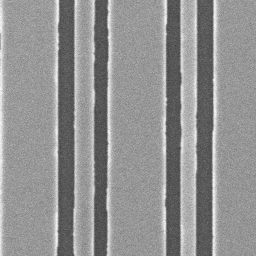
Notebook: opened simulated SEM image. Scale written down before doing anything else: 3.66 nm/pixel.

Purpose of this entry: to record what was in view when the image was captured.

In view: lines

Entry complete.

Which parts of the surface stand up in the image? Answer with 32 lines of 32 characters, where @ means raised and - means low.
@@@@@@@--@@@--@@@@@@@--@@--@@@@@
@@@@@@@--@@@--@@@@@@@--@@--@@@@@
@@@@@@@--@@@--@@@@@@@--@@--@@@@@
@@@@@@@--@@@--@@@@@@@--@@--@@@@@
@@@@@@@--@@@--@@@@@@@--@@--@@@@@
@@@@@@@--@@@--@@@@@@@--@@--@@@@@
@@@@@@@--@@@--@@@@@@@--@@--@@@@@
@@@@@@@--@@@--@@@@@@@--@@--@@@@@
@@@@@@@--@@@--@@@@@@@--@@--@@@@@
@@@@@@@--@@@--@@@@@@@--@@--@@@@@
@@@@@@@--@@@--@@@@@@@--@@--@@@@@
@@@@@@@--@@@--@@@@@@@--@@--@@@@@
@@@@@@@--@@@--@@@@@@@--@@--@@@@@
@@@@@@@--@@@--@@@@@@@--@@--@@@@@
@@@@@@@--@@@--@@@@@@@--@---@@@@@
@@@@@@@--@@@--@@@@@@@--@---@@@@@
@@@@@@@--@@@--@@@@@@@--@@--@@@@@
@@@@@@@--@@@--@@@@@@@--@@--@@@@@
@@@@@@@--@@@--@@@@@@@--@---@@@@@
@@@@@@@--@@@--@@@@@@@--@@--@@@@@
@@@@@@@--@@@--@@@@@@@--@@--@@@@@
@@@@@@@--@@@--@@@@@@@--@@--@@@@@
@@@@@@@--@@@--@@@@@@@--@---@@@@@
@@@@@@@--@@@--@@@@@@@--@---@@@@@
@@@@@@@--@@@-@@@@@@@@--@---@@@@@
@@@@@@@--@@@-@@@@@@@@--@---@@@@@
@@@@@@@--@@@--@@@@@@@--@---@@@@@
@@@@@@@--@@@--@@@@@@@--@---@@@@@
@@@@@@@--@@@--@@@@@@@--@---@@@@@
@@@@@@@--@@@--@@@@@@@--@---@@@@@
@@@@@@@--@@@--@@@@@@@--@---@@@@@
@@@@@@@--@@@--@@@@@@@--@---@@@@@